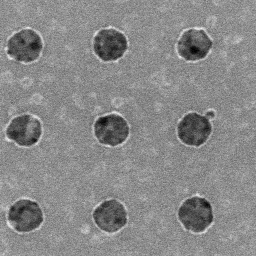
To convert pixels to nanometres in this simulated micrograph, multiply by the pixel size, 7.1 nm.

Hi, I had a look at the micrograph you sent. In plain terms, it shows a regular array of raised bodies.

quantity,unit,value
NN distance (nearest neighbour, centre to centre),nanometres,601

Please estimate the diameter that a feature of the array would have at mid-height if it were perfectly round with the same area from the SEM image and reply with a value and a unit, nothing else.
35.8 pixels